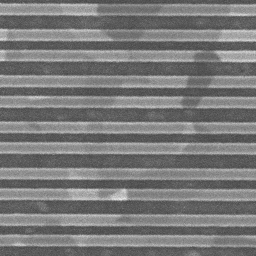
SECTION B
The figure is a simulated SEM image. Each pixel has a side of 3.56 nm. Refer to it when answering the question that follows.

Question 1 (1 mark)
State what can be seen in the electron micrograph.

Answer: parallel lines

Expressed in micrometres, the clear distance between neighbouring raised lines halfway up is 0.044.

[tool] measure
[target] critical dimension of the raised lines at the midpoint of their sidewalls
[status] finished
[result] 0.0365 µm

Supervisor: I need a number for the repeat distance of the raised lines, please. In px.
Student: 23.1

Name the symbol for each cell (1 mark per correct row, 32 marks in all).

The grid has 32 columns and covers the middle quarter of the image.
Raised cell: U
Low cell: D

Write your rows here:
DDDDDDDDDDDDDDDDDDDDDDDDDDDDDDDD
DDDDDDDDDDDDDDDDDDDDDDDDDDDDDDDD
DDDDDDDDDDDDDDDDDDDDDDDDDDDDDDDD
UUUUUUUUUUUUUUUUUUUUUUUUUUUUUUUU
UUUUUUUUUUUUUUUUUUUUUUUUUUUUUUUU
UUUUUUUUUUUUUUUUUUUUUUUUUUUUUUUU
DDDDDDDDDDDDDDDDDDDDDDDDDDDDDDDD
DDDDDDDDDDDDDDDDDDDDDDDDDDDDDDDD
UUUUUUUUUUUUUUUUUUUUUUUUUUUUUUUU
UUUUUUUUUUUUUUUUUUUUUUUUUUUUUUUU
UUUUUUUUUUUUUUUUUUUUUUUUUUUUUUUU
DDDDDDDDDDDDDDDDDDDDDDDDDDDDDDDD
DDDDDDDDDDDDDDDDDDDDDDDDDDDDDDDD
DDDDDDDDDDDDDDDDDDDDDDDDDDDDDDDD
DDDDDDDDDDDDDDDDDDDDDDDDDDDDDDDD
UUUUUUUUUUUUUUUUUUUUUUUUUUUUUUUU
UUUUUUUUUUUUUUUUUUUUUUUUUUUUUUUU
DDDDDDDDDDDDDDDDDDDDDDDDDDDDDDDD
DDDDDDDDDDDDDDDDDDDDDDDDDDDDDDDD
DDDDDDDDDDDDDDDDDDDDDDDDDDDDDDDD
UUUUUUUUUUUUUUUUUUUUUUUUUUUUUUUU
UUUUUUUUUUUUUUUUUUUUUUUUUUUUUUUU
DDDDDDDDDDDDDDDDDDDDDDDDDDDDDDDD
DDDDDDDDDDDDDDDDDDDDDDDDDDDDDDDD
DDDDDDDDDDDDDDDDDDDDDDDDDDDDDDDD
DDDDDDDDDDDDDDDDDDDDDDDDDDDDDDDD
UUUUUUUUUUUUUUUUUUUUUUUUUUUUUUUU
UUUUUUUUUUUUUUUUUUUUUUUUUUUUUUUU
UUUUUUUUUUUUUUUUUUUUUUUUUUUUUUUU
DDDDDDDDDDDDDDDDDDDDDDDDDDDDDDDD
DDDDDDDDDDDDDDDDDDDDDDDDDDDDDDDD
UUUUUUUUUUUUUUUUUUUUUUUUUUUUUUUU